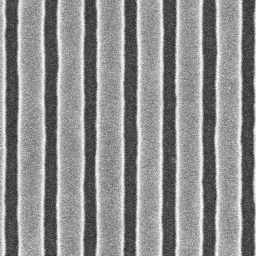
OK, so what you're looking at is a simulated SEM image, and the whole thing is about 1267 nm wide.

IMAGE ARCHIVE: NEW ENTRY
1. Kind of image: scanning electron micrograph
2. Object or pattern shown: parallel lines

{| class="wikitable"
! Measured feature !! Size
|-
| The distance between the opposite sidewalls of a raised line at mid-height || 124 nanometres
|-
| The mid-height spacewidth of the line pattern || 73.6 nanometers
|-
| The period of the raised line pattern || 0.195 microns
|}